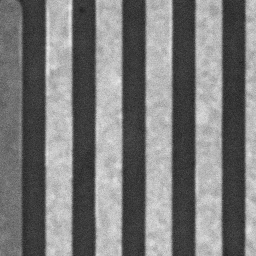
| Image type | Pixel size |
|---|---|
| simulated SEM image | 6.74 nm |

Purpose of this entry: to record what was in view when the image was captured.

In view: groups of lines, slits or small figures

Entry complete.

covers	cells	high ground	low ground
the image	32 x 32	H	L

HHLLLLHHHLLLHHHLLLHHHLLLLHHHLLLH
HHHLLLHHHLLLHHHLLLHHHLLLLHHHLLLH
HHHLLLHHHLLLHHHLLLHHHLLLLHHHLLLH
HHHLLLHHHLLLHHHLLLHHHLLLLHHHLLLH
HHHLLLHHHLLLHHHLLLHHHLLLLHHHLLLH
HHHLLLHHHLLLHHHLLLHHHLLLLHHHLLLH
HHHLLLHHHLLLHHHLLLHHHLLLLHHHLLLH
HHHLLLHHHLLLHHHLLLHHHLLLLHHHLLLH
HHHLLLHHHLLLHHHLLLHHHLLLLHHHLLLH
HHHLLLHHHLLLHHHLLLHHHLLLLHHHLLLH
HHHLLLHHHLLLHHHLLLHHHLLLLHHHLLLH
HHHLLLHHHLLLHHHLLLHHHLLLLHHHLLLH
HHHLLLHHHLLLHHHLLLHHHLLLLHHHLLLH
HHHLLLHHHLLLHHHLLLHHHLLLLHHHLLLH
HHHLLLHHHLLLHHHLLLHHHLLLLHHHLLLH
HHHLLLHHHLLLHHHLLLHHHLLLLHHHLLLH
HHHLLLHHHLLLHHHLLLHHHLLLLHHHLLLH
HHHLLLHHHLLLHHHLLLHHHLLLLHHHLLLH
HHHLLLHHHLLLHHHLLLHHHLLLLHHHLLLH
HHHLLLHHHLLLHHHLLLHHHLLLLHHHLLLH
HHHLLLHHHLLLHHHLLLHHHLLLLHHHLLLH
HHHLLLHHHLLLHHHLLLHHHLLLLHHHLLLH
HHHLLLHHHLLLHHHLLLHHHLLLLHHHLLLH
HHHLLLHHHLLLHHHLLLHHHLLLLHHHLLLH
HHHLLLHHHLLLHHHLLLHHHLLLLHHHLLLH
HHHLLLHHHLLLHHHLLLHHHLLLLHHHLLLH
HHHLLLHHHLLLHHHLLLHHHLLLLHHHLLLH
HHHLLLHHHLLLHHHLLLHHHLLLLHHHLLLH
HHHLLLHHHLLLHHHLLLHHHLLLLHHHLLLH
HHHLLLHHHLLLHHHLLLHHHLLLLHHHLLLH
HHHLLLHHHLLLHHHLLLHHHLLLLHHHLLLH
HHHLLLHHHLLLHHHLLLHHHLLLLHHHLLLH